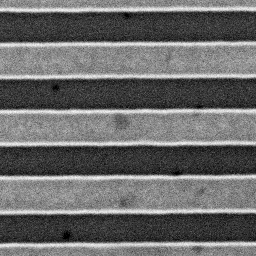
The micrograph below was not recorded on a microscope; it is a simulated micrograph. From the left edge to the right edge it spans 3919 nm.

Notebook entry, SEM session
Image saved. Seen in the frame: wiring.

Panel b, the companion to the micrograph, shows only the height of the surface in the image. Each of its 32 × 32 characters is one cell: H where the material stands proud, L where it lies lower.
HHHHHHHHHHHHHHHHHHHHHHHHHHHHHHHH
LLLLLLLLLLLLLLLLLLLLLLLLLLLLLLLL
LLLLLLLLLLLLLLLLLLLLLLLLLLLLLLLL
LLLLLLLLLLLLLLLLLLLLLLLLLLLLLLLL
LLLLLLLLLLLLLLLLLLLLLLLLLLLLLLLL
LLLLLLLLLLLLLLLLHHLLHHLLHHHHHHHH
HHHHHHHHHHHHHHHHHHHHHHHHHHHHHHHH
HHHHHHHHHHHHHHHHHHHHHHHHHHHHHHHH
HHHHHHHHHHHHHHHHHHHHHHHHHHHHHHHH
HHHHHHHHHHHHHHHHHHHHHHHHHHHLLHHH
LLLLLLLLLLLLLLLLLLLLLLLLLLLLLLLL
LLLLLLLLLLLLLLLLLLLLLLLLLLLLLLLL
LLLLLLLLLLLLLLLLLLLLLLLLLLLLLLLL
LLLLLLLLLLLLLLLLLLLLLLLLLLLLLLLL
HHHHHHHHHHHHHHHHHHHHHHHHHHHHHHHH
HHHHHHHHHHHHHHHHHHHHHHHHHHHHHHHH
HHHHHHHHHHHHHHHHHHHHHHHHHHHHHHHH
HHHHHHHHHHHHHHHHHHHHHHHHHHHHHHHH
LLLLLLLLLLLLLLLLLLLLLLLLLLLLLLLL
LLLLLLLLLLLLLLLLLLLLLLLLLLLLLLLL
LLLLLLLLLLLLLLLLLLLLLLLLLLLLLLLL
LLLLLLLLLLLLLLLLLLLLLLLLLLLLLLLL
HHHHHHHHHHHHHHHHHHHHHHHHHHHHHHHH
HHHHHHHHHHHHHHHHHHHHHHHHHHHHHHHH
HHHHHHHHHHHHHHHHHHHHHHHHHHHHHHHH
HHHHHHHHHHHHHHHHHHHHHHHHHHHHHHHH
HHHHHHHHHHHHHHHHHHHHHLLLLLLLLLLL
LLLLLLLLLLLLLLLLLLLLLLLLLLLLLLLL
LLLLLLLLLLLLLLLLLLLLLLLLLLLLLLLL
LLLLLLLLLLLLLLLLLLLLLLLLLLLLLLLL
LLLLLLLLLLLLLLLLLLLLLLHHHLLLHHHH
HHHHHHHHHHHHHHHHHHHHHHHHHHHHHHHH